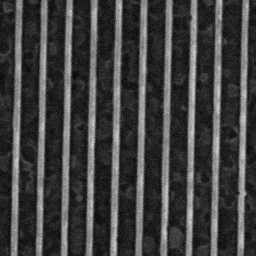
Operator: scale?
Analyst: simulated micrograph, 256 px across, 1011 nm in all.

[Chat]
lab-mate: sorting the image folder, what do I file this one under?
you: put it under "parallel lines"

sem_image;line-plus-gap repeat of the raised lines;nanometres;99.4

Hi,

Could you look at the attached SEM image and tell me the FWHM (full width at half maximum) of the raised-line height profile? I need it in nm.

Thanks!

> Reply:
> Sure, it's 21.2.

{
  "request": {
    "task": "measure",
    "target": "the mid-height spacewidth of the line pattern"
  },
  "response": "77.6 nanometres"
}